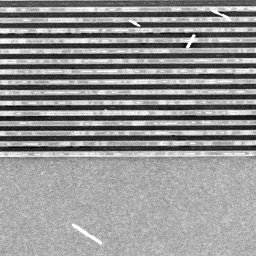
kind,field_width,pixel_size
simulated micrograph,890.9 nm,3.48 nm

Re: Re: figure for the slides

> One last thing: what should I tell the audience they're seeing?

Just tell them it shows parallel lines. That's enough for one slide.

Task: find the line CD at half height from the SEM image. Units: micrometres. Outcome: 0.0165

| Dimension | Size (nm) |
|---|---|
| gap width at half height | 19.6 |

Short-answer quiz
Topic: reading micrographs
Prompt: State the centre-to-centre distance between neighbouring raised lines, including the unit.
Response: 35.9 nm